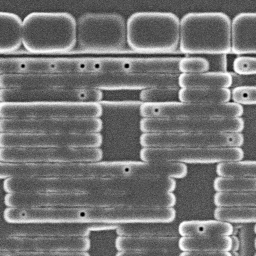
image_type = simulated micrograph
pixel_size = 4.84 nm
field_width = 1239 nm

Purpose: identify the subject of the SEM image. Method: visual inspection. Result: wiring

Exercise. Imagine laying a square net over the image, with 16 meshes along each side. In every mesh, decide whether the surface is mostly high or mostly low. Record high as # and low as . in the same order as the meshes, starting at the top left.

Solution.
................
################
################
............#..#
...........##..#
...........#####
######...#######
######...######.
######...######.
######...######.
############..##
###########..###
###########..###
###########..###
...........###..
...........###..